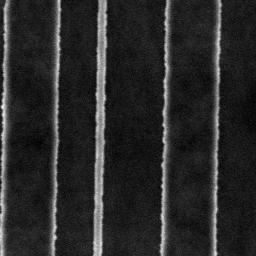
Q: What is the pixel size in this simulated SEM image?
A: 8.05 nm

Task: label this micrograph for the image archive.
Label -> lines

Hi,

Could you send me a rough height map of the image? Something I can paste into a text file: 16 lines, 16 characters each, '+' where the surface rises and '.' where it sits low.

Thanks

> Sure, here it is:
++++......++++..
++++......++++..
++++......++++..
++++......++++..
++++......++++..
++++......++++..
++++......++++..
++++......++++..
++++......++++..
++++......++++..
++++......++++..
++++......++++..
+++.......++++..
+++.......++++..
+++.......++++..
+++.......++++..